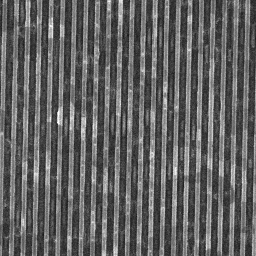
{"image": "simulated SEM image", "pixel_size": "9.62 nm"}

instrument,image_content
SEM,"parallel lines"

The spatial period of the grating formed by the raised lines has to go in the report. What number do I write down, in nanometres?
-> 111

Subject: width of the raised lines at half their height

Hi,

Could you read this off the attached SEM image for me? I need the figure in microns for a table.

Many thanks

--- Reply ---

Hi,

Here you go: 0.0421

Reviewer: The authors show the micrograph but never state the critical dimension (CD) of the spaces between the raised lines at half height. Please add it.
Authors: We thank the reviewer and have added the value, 7.12 pixels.